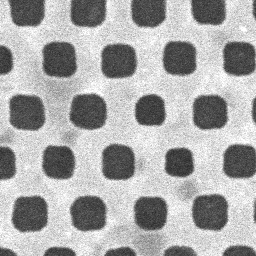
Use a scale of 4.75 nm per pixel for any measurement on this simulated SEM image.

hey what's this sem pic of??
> a regular array of holes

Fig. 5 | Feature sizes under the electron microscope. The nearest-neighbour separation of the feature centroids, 280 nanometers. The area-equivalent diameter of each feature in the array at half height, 177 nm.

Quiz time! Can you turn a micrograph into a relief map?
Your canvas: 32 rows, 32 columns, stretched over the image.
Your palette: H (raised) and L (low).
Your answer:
HLLLLLHHHLLLLHHHLLLLLHHHLLLLHHHL
HLLLLLHHHLLLLHHHLLLLLHHHLLLLHHHH
HHLLLHHHHLLLLHHHHLLLLHHHLLLLHHHH
HHHHHHHHHHHHHHHHHHHHHHHHHHHHHHHH
HHHHHHHHHHHHHHHHHHHHHHHHHHHHHHHH
HHHHHHLLLHHHHHLLHHHHHLLLHHHHLLLH
LHHHHLLLLHHHHLLLLHHHLLLLLHHHLLLL
LLHHHLLLLLHHHLLLLHHHLLLLLHHHLLLL
LLHHHLLLLLHHHLLLLHHHHLLLLHHHLLLL
HHHHHHLLLHHHHLLLHHHHHHHHHHHHHHHH
HHHHHHHHHHHHHHHHHHHHHHHHHHHHHHHH
HHHHHHHHHHHHHHHHHHHHHHHHHHHHHHHH
HLLLLHHHHLLLLHHHHLLLHHHHLLLLHHHH
HLLLLLHHHLLLLHHHHLLLLHHHLLLLHHHL
HLLLLLHHHLLLLHHHHLLLLHHHLLLLLHHL
HLLLLHHHHLLLLHHHHLLLHHHHLLLLHHHH
HHHHHHHHHHHHHHHHHHHHHHHHHHHHHHHH
HHHHHHHHHHHHHHHHHHHHHHHHHHHHHHHH
LHHHHHLLLHHHHLLLHHHHHHHHHHHHLLLL
LLHHHLLLLHHHHLLLLHHHHLLLHHHHLLLL
LLHHHLLLLHHHHLLLLHHHHLLLHHHHLLLL
LLHHHHLLLHHHHLLLLHHHHLLLHHHHLLLL
LHHHHHHHHHHHHHLLHHHHHHHHHHHHHHHH
HHHHHHHHHHHHHHHHHHHHHHHHHHHHHHHH
HHHHLHHHHHHHHHHHHHHHHHHHHLLLHHHH
HHLLLLHHHLLLLHHHHLLLLHHHLLLLHHHH
HHLLLLHHHLLLLHHHHLLLLHHHLLLLHHHH
HLLLLLHHHLLLLHHHHLLLLHHHLLLLHHHH
HHLLLHHHHHLLLHHHHHLLHHHHHLLLHHHH
HHHHHHHHHHHHHHHHHHHHHHHHHHHHHHHH
HHHHHHHHHHHHHHHHHHHHHHHHHHHHHHHH
LLHHHHLLLHHHHLLLLHHHHLLLHHHHLLLL